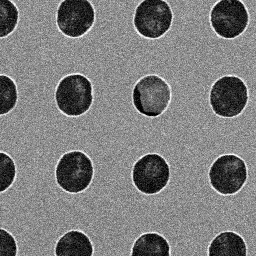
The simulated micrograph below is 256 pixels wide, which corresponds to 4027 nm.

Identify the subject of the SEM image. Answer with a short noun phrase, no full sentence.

holes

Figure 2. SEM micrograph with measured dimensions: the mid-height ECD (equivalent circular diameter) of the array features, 0.615 microns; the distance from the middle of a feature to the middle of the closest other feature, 1210 nanometers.